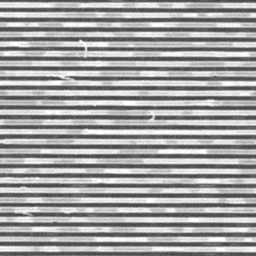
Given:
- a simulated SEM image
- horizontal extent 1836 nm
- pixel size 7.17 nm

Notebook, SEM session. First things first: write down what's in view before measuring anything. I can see parallel lines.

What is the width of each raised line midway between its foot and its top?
26.9 nanometres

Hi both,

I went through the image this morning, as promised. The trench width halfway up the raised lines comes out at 39.4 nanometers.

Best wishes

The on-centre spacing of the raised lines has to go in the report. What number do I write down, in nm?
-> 69.9